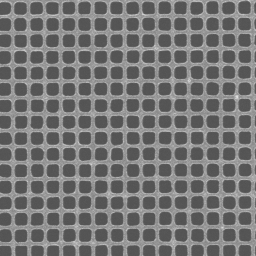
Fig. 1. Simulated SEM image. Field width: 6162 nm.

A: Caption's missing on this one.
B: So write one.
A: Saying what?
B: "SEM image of a regular array of holes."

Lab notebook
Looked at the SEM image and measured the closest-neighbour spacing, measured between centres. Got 374 nm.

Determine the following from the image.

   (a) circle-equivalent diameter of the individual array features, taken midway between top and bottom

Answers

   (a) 0.338 micrometres